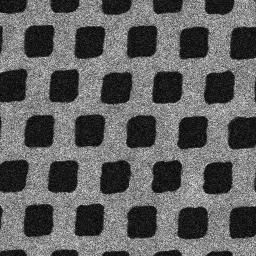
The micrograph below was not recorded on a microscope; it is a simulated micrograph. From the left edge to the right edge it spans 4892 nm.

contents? a regular array of holes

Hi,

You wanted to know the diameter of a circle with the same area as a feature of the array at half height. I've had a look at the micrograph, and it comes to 631 nm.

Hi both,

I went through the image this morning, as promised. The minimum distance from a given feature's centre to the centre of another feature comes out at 967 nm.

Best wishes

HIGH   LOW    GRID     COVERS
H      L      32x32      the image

LLLHHHLLLLHHHLLLHHHLLLLHHHLLLHHH
LLLHHHHLLHHHHLLLHHHLLLHHHHLLLHHH
HHHHHHHHHHHHHHHHHHHHHHHHHHHHHHHH
HHHHLLLHHHLLLHHHLLLLHHHHLLHHHHLL
HHHLLLLHHLLLLHHHLLLLHHHLLLHHHLLL
HHHLLLLHHLLLLHHHLLLLHHLLLLHHHLLL
HHHLLLLHHLLLLHHHLLLHHHLLLLHHHLLL
HHHHHHHHHHHHHHHHHHHHHHHHHHHHHHHH
HHHHHHHHHHHHHHHHHHHHHHHHHHHHHHHH
LLLHHHLLLLHHHLLLHHHLLLLHHHLLLHHH
LLLHHHLLLLHHHLLLLHHLLLLHHHLLLHHH
LLLHHHLLLLHHHLLLHHHLLLLHHHLLLHHH
LLLHHHLLLHHHHLLLHHHLLLHHHHLLLHHH
HHHHHHHHHHHHHHHHHHHHHHHHHHHHHHHH
HHHHLLHHHHLLLHHHHLLHHHHHHHHHHHHH
HHHLLLLHHLLLLHHHLLLHHHHLLLHHHLLL
HHHLLLLHHLLLLHHHLLLHHHLLLLHHHLLL
HHHLLLLHHLLLLHHHLLLHHHLLLLHHLLLL
HHHHHHHHHHHHHHHHLHHHHHHLHHHHHLLH
HHHHHHHHHHHHHHHHHHHHHHHHHHHHHHHH
LLLHHHHLLLHHHLLLHHHLLLLHHHLLLHHH
LLLHHHLLLLHHHLLLHHHLLLLHHHLLLHHH
LLLHHHLLLLHHHLLLHHHLLLLHHHLLLHHH
LLLHHHLLLHHHHLLLHHHLLLHHHLLLLHHH
HHHHHHHHHHHHHHHHHHHHHHHHHHHHHHHH
HHHHHHHHHHHHHHHHHHHHHHHHHHHHHHHH
HHHLLLLHHHLLLHHHLLLLHHHLLLHHHLLL
HHHLLLLHHLLLLHHHLLLLHHLLLLHHHLLL
HHHLLLLHHLLLLHHHLLLLHHLLLLHHHLLL
HHHHLHHHHHLLHHHHLLLHHHLLLHHHHLLL
HHHHHHHHHHHHHHHHHHHHHHHHHHHHHHHH
LLLHHHHLLLHHHHLLHHHHLLHHHHHLLHHH